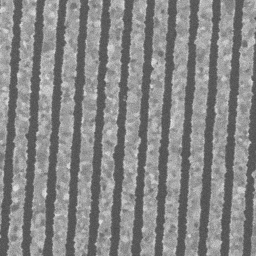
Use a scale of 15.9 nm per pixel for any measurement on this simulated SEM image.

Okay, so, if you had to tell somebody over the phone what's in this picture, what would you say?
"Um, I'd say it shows parallel lines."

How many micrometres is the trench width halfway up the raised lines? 0.146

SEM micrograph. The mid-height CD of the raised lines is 198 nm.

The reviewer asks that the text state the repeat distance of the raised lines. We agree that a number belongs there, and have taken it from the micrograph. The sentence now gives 0.349 um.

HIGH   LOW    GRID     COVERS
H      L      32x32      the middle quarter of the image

HHHLLHHHHLLHHHLLHHHHLLHHHLLLHHHL
HHHLLHHHLLLHHHLLHHHHLLLHHLLLHHHL
HHHLLHHHLLLHHHLLHHHHLLHHHLLHHHHL
HHHLLHHHLLHHHHLLHHHLLLHHHLLHHHLL
HHHLLHHHLLLHHHLLHHHLLLHHHLLHHHHL
HHHLLHHHLLHHHHLLHHHLLLHHHLLHHHLL
HHHLLHHHLLHHHHLLHHHLLLHHHLLHHHLL
HHHLLHHHLLLHHLLLHHHLLHHHHLLHHHLL
HHLLLHHHLLLHHHLLHHHLLLHHHLLHHHLL
HHHLLHHHLLHHHLLLHHHLLHHHHLLHHHLL
HHHLLHHHLLLHHHLLHHHLLHHHLLLHHHLL
HHLLLHHHLLHHHLLLHHHLLHHHLLLHHHLL
HHLLLHHHLLHHHLLLHHHLLHHHLLLHHHLL
HHLLLHHHLLHHHLLLHHHLLHHHLLLHHHLL
HHLLLHHHLLHHHLLLHHHLLHHHLLLHHHLL
HHLLHHHHLLHHHLLHHHHLLHHHLLLHHHLL
HHLLHHHHLLHHHLLLHHHLLHHHLLHHHHLL
HHLLHHHLLLHHHLLLHHLLLHHHLLHHHHLL
HHLLHHHHLLHHHLLHHHHLLHHHLLHHHLLL
HHLLHHHLLLHHHLLHHHHLLHHHLLHHHLLL
HHLLHHHLLLHHHLLHHHLLLHHHLLHHHLLL
HHLLHHHLLLHHLLLHHHLLLHHHLLHHHLLL
HHLLHHHLLLHHLLLHHHLLLHHHLLHHHLLL
HHLLHHHLLLHHLLLHHHLLLHHLLLHHHLLH
HHLLHHHLLLHHLLLHHHLLLHHHLLHHHLLL
HLLLHHHLLHHHLLLHHHLLLHHLLLHHHLLL
HLLLHHHLLHHHLLLHHHLLHHHHLLHHHLLH
HLLLHHHLLHHHLLLHHHLLHHHHLLHHHLLH
HLLLHHHLLHHHLLLHHHLLHHHHLLHHHLLL
HLLLHHHLLHHHHLLHHHLLHHHLLLHHHLLH
HLLLHHLLLHHHLLLHHHLLHHHLLLHHHLLH
HLLLHHHLLHHHLLLHHHLLHHHLLLHHHLLH